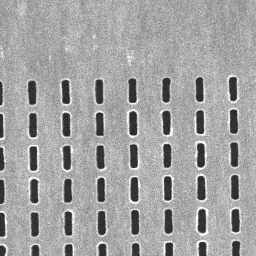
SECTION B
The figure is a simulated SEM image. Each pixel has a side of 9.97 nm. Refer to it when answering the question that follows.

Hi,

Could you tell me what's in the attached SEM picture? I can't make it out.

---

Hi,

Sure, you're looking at a regular array of holes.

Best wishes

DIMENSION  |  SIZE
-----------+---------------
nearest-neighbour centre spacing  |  326 nm